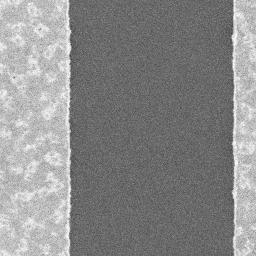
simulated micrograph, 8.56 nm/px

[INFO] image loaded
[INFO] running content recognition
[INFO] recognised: one or a few lines or trenches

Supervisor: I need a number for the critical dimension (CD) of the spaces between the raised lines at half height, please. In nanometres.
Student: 1420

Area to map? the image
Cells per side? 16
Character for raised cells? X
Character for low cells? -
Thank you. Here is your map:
XXXX-----------X
XXXX-----------X
XXXX-----------X
XXXX-----------X
XXXX-----------X
XXXX-----------X
XXXX-----------X
XXXX-----------X
XXXX-----------X
XXXX-----------X
XXXX-----------X
XXXX-----------X
XXXX-----------X
XXXX-----------X
XXXX-----------X
XXXX-----------X